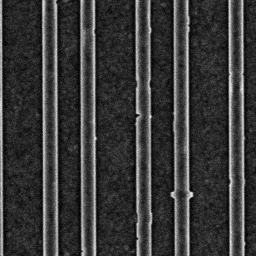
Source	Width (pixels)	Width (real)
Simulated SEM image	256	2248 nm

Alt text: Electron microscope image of parallel lines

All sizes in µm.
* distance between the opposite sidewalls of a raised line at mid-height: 0.123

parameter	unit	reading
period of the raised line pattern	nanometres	409